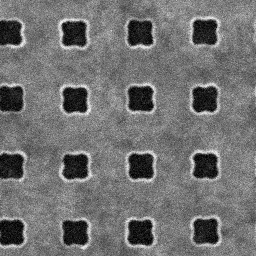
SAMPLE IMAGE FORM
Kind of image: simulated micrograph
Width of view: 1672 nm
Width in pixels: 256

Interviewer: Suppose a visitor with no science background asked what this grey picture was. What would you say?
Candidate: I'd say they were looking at a regular array of holes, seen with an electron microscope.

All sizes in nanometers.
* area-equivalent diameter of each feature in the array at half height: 189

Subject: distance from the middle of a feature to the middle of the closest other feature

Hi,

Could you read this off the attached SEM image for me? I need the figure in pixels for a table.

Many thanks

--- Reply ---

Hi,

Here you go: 65